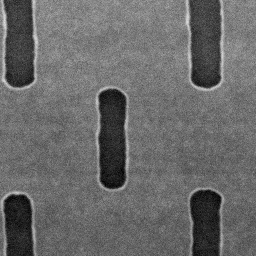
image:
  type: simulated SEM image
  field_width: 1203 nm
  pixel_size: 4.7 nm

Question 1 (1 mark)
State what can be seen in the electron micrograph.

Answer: holes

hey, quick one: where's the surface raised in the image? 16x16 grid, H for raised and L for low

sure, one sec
LLHHHHHHHHHHLLHH
LLHHHHHHHHHHLLHH
LLHHHHHHHHHHLLHH
LLHHHHHHHHHHLLHH
LLHHHHHHHHHHLLHH
HHHHHHHHHHHHHHHH
HHHHHHLLHHHHHHHH
HHHHHHLLHHHHHHHH
HHHHHHLLHHHHHHHH
HHHHHHLLHHHHHHHH
HHHHHHLLHHHHHHHH
HHHHHHLLHHHHHHHH
LLHHHHHHHHHHLLHH
LLHHHHHHHHHHLLHH
LLHHHHHHHHHHLLHH
LLHHHHHHHHHHLLHH